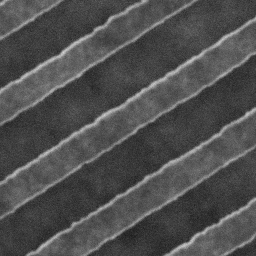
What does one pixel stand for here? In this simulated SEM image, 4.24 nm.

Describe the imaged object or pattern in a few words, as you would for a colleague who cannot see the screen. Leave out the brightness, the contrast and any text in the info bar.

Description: lines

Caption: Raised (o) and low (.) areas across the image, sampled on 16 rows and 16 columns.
ooo.....oooo....
oo....oooo.....o
.....ooo......oo
....ooo.....oooo
..ooo......ooo..
oooo.....oooo...
oo......ooo.....
o.....oooo.....o
....oooo.....ooo
...oooo.....ooo.
.oooo.....oooo..
ooo......ooo....
oo.....oooo.....
.....oooo.....oo
....oooo.....ooo
..oooo.....oooo.